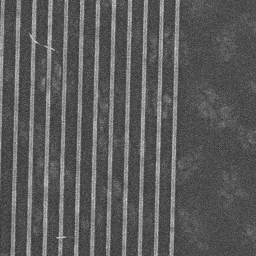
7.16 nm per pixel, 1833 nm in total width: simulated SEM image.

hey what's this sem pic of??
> parallel lines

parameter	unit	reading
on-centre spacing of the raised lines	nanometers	114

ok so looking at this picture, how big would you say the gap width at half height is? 0.0859 micrometres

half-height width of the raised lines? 0.0251 um